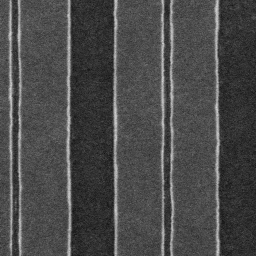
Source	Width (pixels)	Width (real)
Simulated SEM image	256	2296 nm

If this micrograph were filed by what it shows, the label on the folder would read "lines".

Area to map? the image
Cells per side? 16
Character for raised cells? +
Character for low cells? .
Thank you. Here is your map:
++++...+++++++..
++++...+++++++..
++++...++++++...
++++...+++++++..
++++...+++++++..
++++...+++++++..
++++...+++++++..
++++...+++++++..
++++...+++++++..
++++...+++++++..
++++...+++++++..
++++...+++++++..
++++...+++++++..
++++...+++++++..
++++...+++++++..
++++...+++++++..